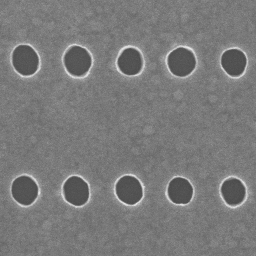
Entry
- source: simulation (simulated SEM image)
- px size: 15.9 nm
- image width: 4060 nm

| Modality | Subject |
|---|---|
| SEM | a regular array of holes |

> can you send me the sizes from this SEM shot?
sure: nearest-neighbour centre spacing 814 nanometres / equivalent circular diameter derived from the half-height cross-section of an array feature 0.443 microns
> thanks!